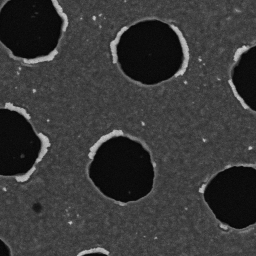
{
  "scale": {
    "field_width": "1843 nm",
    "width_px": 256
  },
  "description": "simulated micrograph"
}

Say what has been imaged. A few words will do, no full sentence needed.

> holes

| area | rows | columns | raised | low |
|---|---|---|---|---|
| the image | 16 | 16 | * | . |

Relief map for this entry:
...*************
....****..******
....***....*****
*..****....****.
********...****.
***************.
***************.
..**************
..**************
..****...*******
..****....****..
******....***...
*******.*****...
*************...
****************
****************